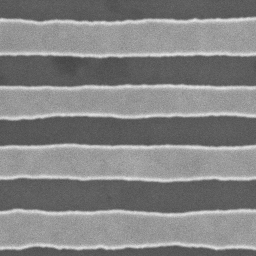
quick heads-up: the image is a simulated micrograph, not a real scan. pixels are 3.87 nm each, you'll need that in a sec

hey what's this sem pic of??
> lines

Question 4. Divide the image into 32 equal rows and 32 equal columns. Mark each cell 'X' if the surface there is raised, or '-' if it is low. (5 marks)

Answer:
--------------------------------
--------------------------------
XXX--------------XXXXX--XXXXXXXX
XXXXXXXXXXXXXXXXXXXXXXXXXXXXXXXX
XXXXXXXXXXXXXXXXXXXXXXXXXXXXXXXX
XXXXXXXXXXXXXXXXXXXXXXXXXXXXXXXX
XXXXXXXXXXXXXXXXXXXXXXXXXXXXXXXX
--------------------------------
--------------------------------
--------------------------------
--------------------------------
XXXXXXXXXXXXXXXXXXXXXXXXXXXXXXXX
XXXXXXXXXXXXXXXXXXXXXXXXXXXXXXXX
XXXXXXXXXXXXXXXXXXXXXXXXXXXXXXXX
XXXXXXXXXX-XXXXXXXXXXXXXXX----XX
--------------------------------
--------------------------------
--------------------------------
XXXXXXXXXXXXXXXXXXXXXXXXXXXXXXXX
XXXXXXXXXXXXXXXXXXXXXXXXXXXXXXXX
XXXXXXXXXXXXXXXXXXXXXXXXXXXXXXXX
XXXXXXXXXXXXXXXXXXXXXXXXXXXXXXXX
----------X----XXXXXXXXXX--XXXXX
--------------------------------
--------------------------------
--------------------------------
XXXXXXXXXXXXXXXXXXX----XXXXXXXXX
XXXXXXXXXXXXXXXXXXXXXXXXXXXXXXXX
XXXXXXXXXXXXXXXXXXXXXXXXXXXXXXXX
XXXXXXXXXXXXXXXXXXXXXXXXXXXXXXXX
XXXXXXXXXXXXXXXXXXXXXXXXXXXXXXXX
--------------------------------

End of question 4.